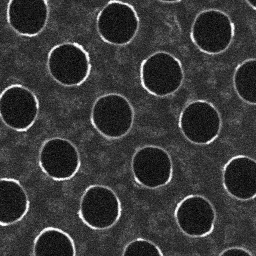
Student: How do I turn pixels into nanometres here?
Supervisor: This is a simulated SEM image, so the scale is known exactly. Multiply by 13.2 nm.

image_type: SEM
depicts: a regular array of holes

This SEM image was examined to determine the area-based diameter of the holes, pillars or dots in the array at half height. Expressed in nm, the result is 526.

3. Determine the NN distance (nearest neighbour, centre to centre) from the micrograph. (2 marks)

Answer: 844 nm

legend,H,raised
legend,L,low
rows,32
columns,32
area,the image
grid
HLLLLLHHHHHHHHLHHHHHHHHHHHHHHHHL
HLLLLLHHHHHHHLLLLHHHHHHHHHLHHHHH
HLLLLLHHHHHHLLLLLHHHHHHHHLLLLHHH
HHLLLHHHHHHHLLLLLHHHHHHHLLLLLHHH
HHHHHHHHHHHHHLLLLHHHHHHHLLLLLHHH
HHHHHHHHHHHHHHHHHHHHHHHHHLLLLHHH
HHHHHHHLLLHHHHHHHHHHHHHHHHLHHHHH
HHHHHHLLLLLHHHHHHHLLLLHHHHHHHHHH
HHHHHHLLLLLHHHHHHHLLLLLHHHHHHHLL
HHHHHHHLLLLHHHHHHHLLLLLHHHHHHLLL
HHHHHHHHLHHHHHHHHHLLLLLHHHHHHLLL
HLLLHHHHHHHHHHHHHHHLLHHHHHHHHHLL
LLLLHHHHHHHHLLLLHHHHHHHHHHHHHHHL
LLLLLHHHHHHHLLLLHHHHHHHLLLLHHHHH
LLLLHHHHHHHHLLLLLHHHHHHLLLLHHHHH
HLLLHHHHHHHHLLLLHHHHHHHLLLLHHHHH
HHHHHHHHHHHHHLLLHHHHHHHLLLLHHHHH
HHHHHHLLHHHHHHHHHHHHHHHHLLHHHHHH
HHHHHLLLLHHHHHHHHHLLHHHHHHHHHHHH
HHHHHLLLLLHHHHHHHLLLLHHHHHHHHHHH
HHHHHLLLLLHHHHHHHLLLLHHHHHHHHLLL
HHHHHHLLLHHHHHHHHLLLLHHHHHHHLLLL
HHHHHHHHHHHHHHHHHLLLLHHHHHHHLLLL
LLLHHHHHHHHLLHHHHHHHHHHHHHHHLLLL
LLLHHHHHHHHLLLHHHHHHHHHHHHHHHLLL
LLLHHHHHHHLLLLLHHHHHHHHLLLHHHHHH
LLLHHHHHHHLLLLLHHHHHHHLLLLLHHHHH
LLHHHHHHHHHLLLHHHHHHHHLLLLLHHHHH
HHHHHHHHHHHHHHHHHHHHHHHLLLHHHHHH
HHHHHLLLHHHHHHHHHHHHHHHHHHHHHHHH
HHHHLLLLLHHHHHHHLLLHHHHHHHHHHHHH
HHHHLLLLLHHHHHHHLLLLHHHHHHHHLLLH